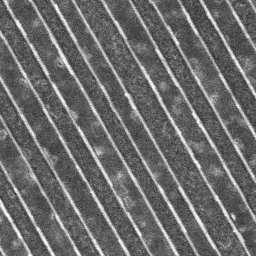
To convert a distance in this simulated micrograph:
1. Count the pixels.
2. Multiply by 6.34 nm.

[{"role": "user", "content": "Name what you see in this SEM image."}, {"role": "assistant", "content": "parallel lines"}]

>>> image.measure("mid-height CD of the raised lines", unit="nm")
152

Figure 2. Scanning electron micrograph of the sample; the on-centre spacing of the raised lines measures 269 nanometres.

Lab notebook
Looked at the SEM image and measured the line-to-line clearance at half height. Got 118 nanometers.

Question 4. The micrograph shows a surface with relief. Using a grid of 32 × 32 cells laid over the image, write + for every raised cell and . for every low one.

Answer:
.+++...++....+++...++++..++++..+
.++++..+++....+++...+++...+++...
..+++...+++...++++..++++..++++..
..++++..+++....+++...+++...++++.
...+++...+++...++++..++++...+++.
+...+++...++....+++...++++..++++
+...++++..+++...++++...+++...+++
++...+++...++....++++..++++..+++
+++..++++..+++....+++...+++...++
+++...+++...+++...++++..++++...+
++++..++++...++....+++...+++...+
.+++...+++...+++...++++...+++...
..+++...+++...++....+++...+++...
..++++..++++..+++...++++...+++..
...+++...+++...++....++++..++++.
+..++++..++++..+++....+++...+++.
+...+++...+++...+++...++++..++++
++..++++...+++..+++....+++...+++
++...+++...++++..+++...++++..+++
+++...+++...+++...++....+++...++
+++...++++..++++..+++...++++...+
.+++...+++...+++...++....++++..+
.++++..++++..++++..+++....+++...
..+++...+++...+++...+++...++++..
..++++..++++...+++..+++....+++..
...+++...++++..++++..+++...++++.
+..++++...+++...+++...++....+++.
+...+++...++++..++++..+++....+++
++...+++...+++...+++...+++...+++
+++..++++..++++..++++..+++....++
+++...+++...+++...+++...+++...++
++++..++++..++++...+++..+++....+